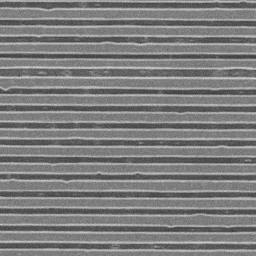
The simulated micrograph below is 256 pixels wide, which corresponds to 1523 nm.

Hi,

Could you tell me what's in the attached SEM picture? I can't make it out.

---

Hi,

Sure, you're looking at parallel lines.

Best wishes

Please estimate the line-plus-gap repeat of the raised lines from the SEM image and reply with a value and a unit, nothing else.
102 nm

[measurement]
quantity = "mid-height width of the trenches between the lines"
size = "7.24 pixels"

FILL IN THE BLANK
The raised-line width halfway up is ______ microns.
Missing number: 0.0595